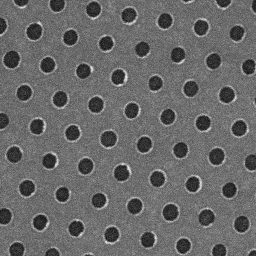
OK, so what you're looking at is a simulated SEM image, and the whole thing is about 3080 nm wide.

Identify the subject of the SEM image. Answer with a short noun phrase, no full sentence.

a regular array of holes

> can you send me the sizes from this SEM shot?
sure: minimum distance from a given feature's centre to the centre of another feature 429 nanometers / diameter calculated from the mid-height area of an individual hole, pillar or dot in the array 190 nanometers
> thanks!